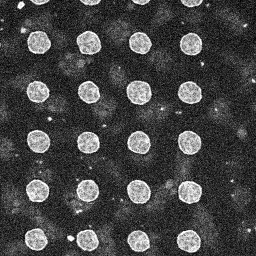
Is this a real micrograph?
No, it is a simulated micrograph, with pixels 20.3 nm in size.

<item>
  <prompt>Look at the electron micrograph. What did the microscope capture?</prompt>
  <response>a regular array of raised bodies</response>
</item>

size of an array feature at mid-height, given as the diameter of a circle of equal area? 447 nm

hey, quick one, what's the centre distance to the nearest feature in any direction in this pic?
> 0.999 µm